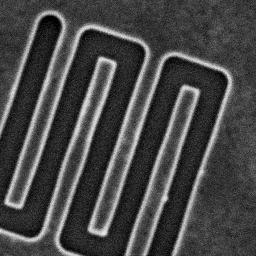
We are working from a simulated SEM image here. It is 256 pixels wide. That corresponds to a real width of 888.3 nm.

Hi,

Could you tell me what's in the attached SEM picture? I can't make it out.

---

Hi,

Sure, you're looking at groups of lines, slits or small figures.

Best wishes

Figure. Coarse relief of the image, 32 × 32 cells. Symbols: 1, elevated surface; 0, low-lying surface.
11111111111111111111111111111111
11111111111111111111111111111111
11111000111111111111111111111111
11110000111011111111111111111111
11110000110000011111111111111111
11110001110000000011111111111111
11100001100000000011111111111111
11100001100001000011100011111111
11100011000011000011000000011111
11000011000011000111000000001111
11000011000111000110000000000111
11000111000110000110000110001111
10000110000110000110001110001111
10000110001110001100001100001111
10001110001100001100001100011111
00001100001100011100011000011111
00001100011100011000011000011111
00011100011000011000011000111111
00011000011000011000111000111111
00011000111000110000110000111111
00111000110000110001110001111111
00110000110001110001110001111111
00110001110001100001100001111111
01110001100001100001100011111111
01100001100001100011100011111111
01100011100011100011000011111111
00000011000011000011000111111111
00000011000011000111000111111111
00000011000110000110000111111111
11000110000000000110001111111111
11111110000000001110001111111111
11111111000000001100001111111111